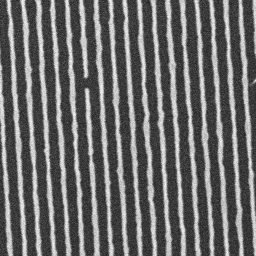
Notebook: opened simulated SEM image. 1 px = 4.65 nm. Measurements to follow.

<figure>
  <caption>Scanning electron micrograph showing parallel lines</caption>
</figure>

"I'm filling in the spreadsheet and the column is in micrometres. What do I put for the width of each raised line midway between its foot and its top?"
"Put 0.0203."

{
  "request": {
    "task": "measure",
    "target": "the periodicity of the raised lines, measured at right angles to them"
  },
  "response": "67 nm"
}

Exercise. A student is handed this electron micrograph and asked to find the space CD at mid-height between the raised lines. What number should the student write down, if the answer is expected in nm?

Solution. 49.3